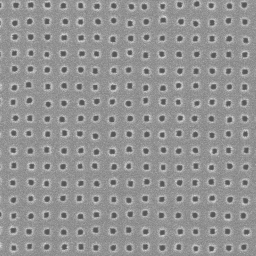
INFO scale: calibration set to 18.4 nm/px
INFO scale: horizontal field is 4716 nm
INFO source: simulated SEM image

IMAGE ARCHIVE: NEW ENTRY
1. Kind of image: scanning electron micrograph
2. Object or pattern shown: a regular array of holes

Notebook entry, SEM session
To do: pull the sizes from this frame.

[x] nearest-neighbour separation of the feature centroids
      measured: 279 nm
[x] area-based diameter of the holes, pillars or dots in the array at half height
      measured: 6.18 pixels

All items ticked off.